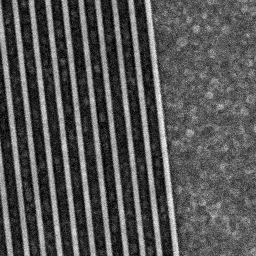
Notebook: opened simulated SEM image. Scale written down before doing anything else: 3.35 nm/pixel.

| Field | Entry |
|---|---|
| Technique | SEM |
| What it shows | parallel lines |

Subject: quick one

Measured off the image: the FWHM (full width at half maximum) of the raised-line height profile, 14.5 nm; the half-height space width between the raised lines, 0.0407 um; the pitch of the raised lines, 55.2 nm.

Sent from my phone